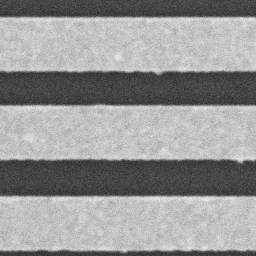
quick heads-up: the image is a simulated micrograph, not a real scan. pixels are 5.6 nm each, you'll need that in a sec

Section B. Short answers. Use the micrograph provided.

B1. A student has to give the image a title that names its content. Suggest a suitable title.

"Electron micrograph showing lines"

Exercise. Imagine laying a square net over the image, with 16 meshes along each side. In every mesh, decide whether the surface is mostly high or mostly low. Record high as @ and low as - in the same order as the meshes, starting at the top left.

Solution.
----------------
@@@@@@@@@@@@@@@@
@@@@@@@@@@@@@@@@
@@@@@@@@@@@@@@@@
----------------
----------------
----------------
@@@@@@@@@@@@@@@@
@@@@@@@@@@@@@@@@
@@@@@@@@@@@@@@@@
----------------
----------------
@@@@@@@@@@@@@@@@
@@@@@@@@@@@@@@@@
@@@@@@@@@@@@@@@@
@@@@@@@@@@@@@@@@